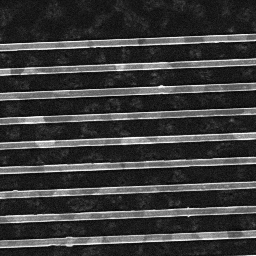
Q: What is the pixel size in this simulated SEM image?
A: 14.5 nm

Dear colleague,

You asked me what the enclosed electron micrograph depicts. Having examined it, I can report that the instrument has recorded parallel lines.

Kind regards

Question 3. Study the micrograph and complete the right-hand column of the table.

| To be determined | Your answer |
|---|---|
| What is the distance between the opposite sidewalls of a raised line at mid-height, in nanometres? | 98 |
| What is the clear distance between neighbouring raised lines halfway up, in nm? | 265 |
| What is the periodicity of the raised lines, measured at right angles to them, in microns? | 0.357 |